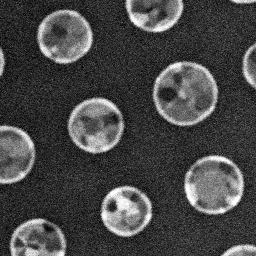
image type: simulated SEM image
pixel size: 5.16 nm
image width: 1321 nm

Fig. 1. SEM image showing raised bodies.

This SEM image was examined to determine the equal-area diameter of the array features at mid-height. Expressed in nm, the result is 265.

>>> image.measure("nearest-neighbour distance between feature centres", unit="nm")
473